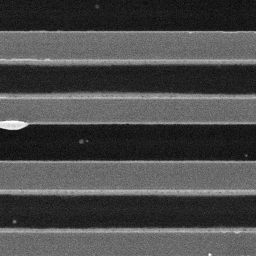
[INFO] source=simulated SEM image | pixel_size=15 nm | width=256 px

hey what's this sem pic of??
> lines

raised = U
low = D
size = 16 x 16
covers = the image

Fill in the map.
DDDDDDDDDDDDDDDD
DDDDDDDDDDDDDDDD
UUUUUUUUUUUUUUUU
UUUUUUUUUUUUUUUU
DDDDDDDDDDDDDDDD
DDDDDDDDDDDDDDDD
UUUUUUUUUUUUUUUU
UUUUUUUUUUUUUUUU
DDDDDDDDDDDDDDDD
DDDDDDDDDDDDDDDD
UUUUUUUUUUUUUUUU
UUUUUUUUUUUUUUUU
DDDDDDDDDDDDDDDD
DDDDDDDDDDDDDDDD
UDDDDDDDUDUUDDDD
UUUUUUUUUUUUUUUU